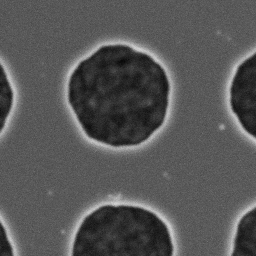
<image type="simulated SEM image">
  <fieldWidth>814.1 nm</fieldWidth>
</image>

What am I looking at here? holes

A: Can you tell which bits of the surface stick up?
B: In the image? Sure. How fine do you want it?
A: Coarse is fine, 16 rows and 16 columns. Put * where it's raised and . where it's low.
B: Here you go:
****************
****************
****************
******...*******
*****.....*****.
.***.......***..
.***......****..
*****.....*****.
******...*******
****************
****************
****************
****************
*****.....*****.
*****......****.
.****......****.